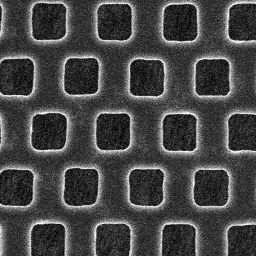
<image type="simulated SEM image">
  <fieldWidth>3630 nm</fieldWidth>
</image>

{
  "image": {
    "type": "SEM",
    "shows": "a regular array of holes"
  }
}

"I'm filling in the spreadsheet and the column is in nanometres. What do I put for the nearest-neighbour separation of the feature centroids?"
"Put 903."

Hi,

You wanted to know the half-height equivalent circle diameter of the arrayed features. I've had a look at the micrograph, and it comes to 0.556 µm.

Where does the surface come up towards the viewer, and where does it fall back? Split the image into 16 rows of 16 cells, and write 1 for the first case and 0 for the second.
1100110011001110
1100110011001100
1111111011101110
1111111111111111
0011001100110011
0011001100110011
1111111111111111
1100110011001100
1100110011001100
1111111111111111
1111111111111111
0011001100110011
0011001100110011
1111111111111111
1100110011001100
1100110011001100